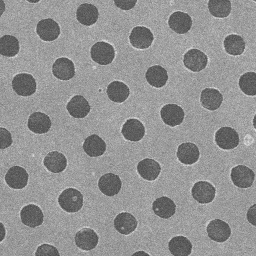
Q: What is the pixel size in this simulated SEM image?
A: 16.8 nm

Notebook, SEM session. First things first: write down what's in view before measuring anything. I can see a regular array of holes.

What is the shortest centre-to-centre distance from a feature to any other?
697 nanometres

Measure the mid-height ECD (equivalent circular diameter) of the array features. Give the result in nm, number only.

396